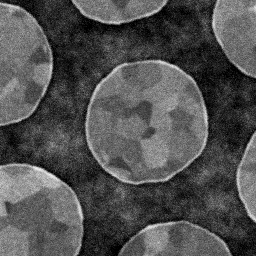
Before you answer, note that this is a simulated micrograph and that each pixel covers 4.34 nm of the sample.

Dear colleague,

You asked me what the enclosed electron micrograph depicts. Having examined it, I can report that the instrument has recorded raised bodies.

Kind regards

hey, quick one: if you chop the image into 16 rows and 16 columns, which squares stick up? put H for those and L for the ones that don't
HLLLLHHHHHLLLHHH
HHLLLLLLLLLLLHHH
HHHLLLLLLLLLLLHH
HHHLLLLLLLLLLLHH
HHHLLLLHHHHLLLLH
HHHLLLHHHHHHLLLL
HHLLLLHHHHHHHLLL
HLLLLHHHHHHHHLLL
LLLLLHHHHHHHHLLL
LLLLLLHHHHHHHLLH
HHLLLLLHHHHLLLLH
HHHHLLLLLLLLLLLH
HHHHHLLLLLLLLLLH
HHHHHLLLLLLLLLLL
HHHHHLLLLHHHHLLL
HHHHHLLLHHHHHHLL